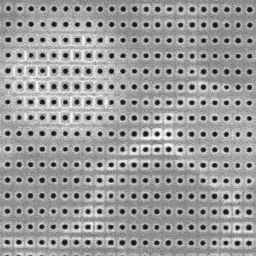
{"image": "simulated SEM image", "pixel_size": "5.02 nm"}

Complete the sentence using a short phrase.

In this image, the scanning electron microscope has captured a regular array of holes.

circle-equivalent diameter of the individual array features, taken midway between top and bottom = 25.3 nanometers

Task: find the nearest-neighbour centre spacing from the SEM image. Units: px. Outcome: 11.2